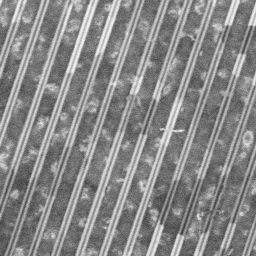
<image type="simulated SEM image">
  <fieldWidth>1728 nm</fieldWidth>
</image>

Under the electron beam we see parallel lines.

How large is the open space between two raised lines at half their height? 120 nanometres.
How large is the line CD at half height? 0.0344 um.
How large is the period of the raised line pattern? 152 nanometres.